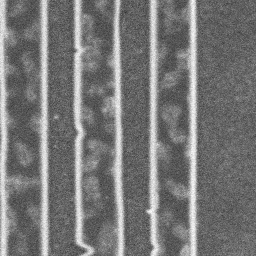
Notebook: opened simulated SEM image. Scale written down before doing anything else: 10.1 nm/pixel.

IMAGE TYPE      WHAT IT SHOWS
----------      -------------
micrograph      one or a few lines or trenches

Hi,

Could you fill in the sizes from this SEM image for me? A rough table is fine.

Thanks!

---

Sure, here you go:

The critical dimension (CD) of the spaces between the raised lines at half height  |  341 nm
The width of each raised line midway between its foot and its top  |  416 nanometres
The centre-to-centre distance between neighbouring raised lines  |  756 nm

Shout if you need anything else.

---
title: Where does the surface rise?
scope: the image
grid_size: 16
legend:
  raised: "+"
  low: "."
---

+++..++...++....
+++..++...++....
+++..++...++....
+++..++...++....
+++..++...++....
+++..++...++....
+++..++...++....
+++..++...++....
+++..++...++....
+++..++...++....
+++..++...++....
+++..++...++....
+++..++...++....
+++..+++..++....
+++..+++..++....
+++..+++..++....